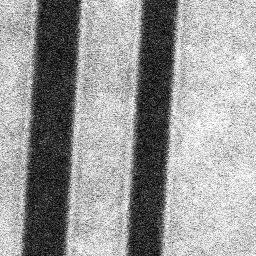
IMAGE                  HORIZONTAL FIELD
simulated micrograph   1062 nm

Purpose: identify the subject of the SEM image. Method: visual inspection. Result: one or a few lines or trenches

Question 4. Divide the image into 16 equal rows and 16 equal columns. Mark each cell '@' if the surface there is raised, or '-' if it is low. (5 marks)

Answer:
--@@@----@@-----
--@@@----@@-----
--@@@---@@@-----
--@@@---@@@-----
--@@@---@@@-----
--@@@---@@@-----
--@@@---@@@-----
--@@@---@@@-----
--@@@---@@@-----
--@@@---@@@-----
-@@@@---@@@-----
-@@@@---@@@-----
-@@@@---@@@-----
-@@@----@@@-----
-@@@----@@------
-@@@----@@------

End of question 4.